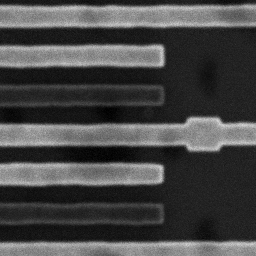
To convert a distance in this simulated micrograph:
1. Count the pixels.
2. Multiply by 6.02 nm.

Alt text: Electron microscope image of wiring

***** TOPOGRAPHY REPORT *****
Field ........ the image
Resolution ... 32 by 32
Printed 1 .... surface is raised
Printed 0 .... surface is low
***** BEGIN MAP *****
00000000000000000000000000000000
11111111111111111111111111111111
11111111111111111111111111111111
00000000000000000000000000000000
00000000000000000000000000000000
00000000000000000000000000000000
11111111111111111111000000000000
11111111111111111111000000000000
00000000000000000000000000000000
00000000000000000000000000000000
00000000000000000000000000000000
11111111111111111111000000000000
11111111111111111111000000000000
00000000000000000000000000000000
00000000000000000000000000000000
00000000000000000000000111110111
11111111111111111111111111111111
11111111111111111111111111111111
00000000000000000000000111100000
00000000000000000000000000000000
01110111110001110000000000000000
11111111111111111111000000000000
11111111111111111111000000000000
00000000000000000000000000000000
00000000000000000000000000000000
00000000000000000000000000000000
11111111111111111111000000000000
11111111111111111111000000000000
00000000000000000000000000000000
00000000000000000000000000000000
11111111111111111111111111111111
11111111111111111111111111111111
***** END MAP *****